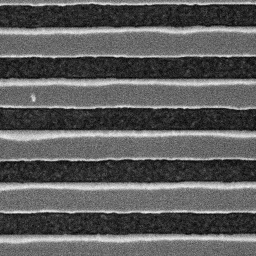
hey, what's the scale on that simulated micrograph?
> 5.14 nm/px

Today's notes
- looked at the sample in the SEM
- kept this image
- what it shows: lines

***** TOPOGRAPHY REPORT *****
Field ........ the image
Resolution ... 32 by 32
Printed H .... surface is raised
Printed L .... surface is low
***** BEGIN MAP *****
HHHHHHHHHHLLHHHHHHHLLLHHHHLLLLLL
LLLLLLLLLLLLLLLLLLLLLLLLLLLLLLLL
LLLLLLLLLLLLLLLLLLLLLLLLLLLLLLLL
LLLLLLLLLLLLLLLLLLLLLLLLLLLLLLLL
HHHHHHHHHHHHHHHHHHHHHHHHHHHHHHHH
HHHHHHHHHHHHHHHHHHHHHHHHHHHHHHHH
HHHHHHHHHHHHHHHHHHHHHHHHHHHHHHHH
LLLLLLLLLLLLLLLLLLLLLLLLLLLLLLLL
LLLLLLLLLLLLLLLLLLLLLLLLLLLLLLLL
LLLLLLLLLLLLLLLLLLLLLLLLLLLLLLLL
HHHHHHHHHHHHHHHHHHHHHHHHHHHHHHHH
HHHHHHHHHHHHHHHHHHHHHHHHHHHHHHHH
HHHHHHHHHHHHHHHHHHHHHHHHHHHHHHHH
LLLLLLHLHHHHHLLLLLLHHHHHHLLLHHHH
LLLLLLLLLLLLLLLLLLLLLLLLLLLLLLLL
LLLLLLLLLLLLLLLLLLLLLLLLLLLLLLLL
LLLLLLLLLLLHLHHLLLLLLHHHHHHLLLLL
HHHHHHHHHHHHHHHHHHHHHHHHHHHHHHHH
HHHHHHHHHHHHHHHHHHHHHHHHHHHHHHHH
HHHHHHHHHHHHHHHHHHHHHHHHHHHHHHHH
LLLLLLLLLLLLLLLLLLLLLLLLLLLLLLLL
LLLLLLLLLLLLLLLLLLLLLLLLLLLLLLLL
LLLLLLLLLLLLLLLLLLLLLLLLLLLLLLLL
HHHHHHHHHHHHHHHHHHHHHHHHHHHHHHHH
HHHHHHHHHHHHHHHHHHHHHHHHHHHHHHHH
HHHHHHHHHHHHHHHHHHHHHHHHHHHHHHHH
HHHHHLLLHHLLLHHHHHHHHLLLHHHHHLLH
LLLLLLLLLLLLLLLLLLLLLLLLLLLLLLLL
LLLLLLLLLLLLLLLLLLLLLLLLLLLLLLLL
LLLLLLLLLLLLLLLLLLLLLLLLLLLLLLLL
HHHHHHHHHHHHHHHHHHHHHHHHHHHHHHHH
HHHHHHHHHHHHHHHHHHHHHHHHHHHHHHHH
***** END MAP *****